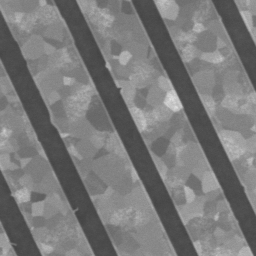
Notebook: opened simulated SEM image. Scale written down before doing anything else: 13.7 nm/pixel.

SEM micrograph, one or a few lines or trenches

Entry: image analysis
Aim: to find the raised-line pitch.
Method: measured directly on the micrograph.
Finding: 975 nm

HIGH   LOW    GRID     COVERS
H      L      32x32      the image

HHHHHHHLLLHHHHHHLLLLHHHHHHLLLLHH
HHHHHHHLLLHHHHHHHLLLHHHHHHHLLLHH
LHHHHHHHLLLHHHHHHLLLLHHHHHHHLLLH
LHHHHHHHLLLHHHHHHHLLLHHHHHHHLLLH
LLHHHHHHHLLLHHHHHHLLLHHHHHHHLLLL
LLHHHHHHHLLLHHHHHHHLLLHHHHHHHLLL
LLLHHHHHHHLLLHHHHHHLLLHHHHHHHLLL
LLLHHHHHHHLLLHHHHHHHLLLHHHHHHHLL
LLLLHHHHHHHLLLHHHHHHLLLHHHHHHHLL
HLLLHHHHHHHLLLHHHHHHHLLLHHHHHHHL
HLLLLHHHHHHHLLLHHHHHHLLLHHHHHHHL
HHLLLHHHHHHHLLLHHHHHHHLLLHHHHHHH
HHLLLLHHHHHHHLLLHHHHHHLLLHHHHHHH
HHHLLLHHHHHHHLLLHHHHHHHLLLHHHHHH
HHHLLLHHHHHHHHLLLHHHHHHLLLHHHHHH
HHHHLLLHHHHHHHLLLHHHHHHHLLLHHHHH
HHHHLLLHHHHHHHLLLLHHHHHHLLLHHHHH
HHHHHLLLHHHHHHHLLLHHHHHHHLLLHHHH
HHHHHLLLLHHHHHHLLLHHHHHHHLLLHHHH
HHHHHHLLLHHHHHHHLLLHHHHHHHLLLHHH
HHHHHHLLLHHHHHHHLLLHHHHHHHLLLHHH
HHHHHHHLLLHHHHHHHLLLHHHHHHHLLLHH
LHHHHHHLLLHHHHHHHLLLHHHHHHHLLLHH
LHHHHHHHLLLHHHHHHHLLLHHHHHHLLLLH
LLHHHHHHLLLHHHHHHHLLLHHHHHHHLLLH
LLHHHHHHLLLLHHHHHHHLLLHHHHHHLLLH
LLLHHHHHHLLLHHHHHHHLLLHHHHHHHLLL
LLLHHHHHHHLLLHHHHHHHLLLHHHHHHLLL
LLLLHHHHHHLLLHHHHHHHLLLHHHHHHHLL
HLLLHHHHHHHLLLHHHHHHHLLLHHHHHHLL
HLLLLHHHHHHLLLHHHHHHHLLLHHHHHHHL
HHLLLHHHHHHLLLLHHHHHHHLLLHHHHHHL